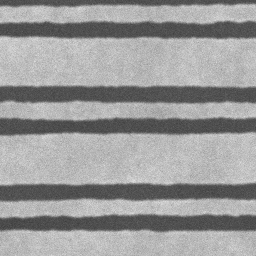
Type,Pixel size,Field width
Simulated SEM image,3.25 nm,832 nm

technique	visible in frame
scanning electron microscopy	lines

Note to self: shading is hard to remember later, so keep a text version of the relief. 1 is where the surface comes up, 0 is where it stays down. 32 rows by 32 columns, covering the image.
00000000000000000000000000000000
11111111111111111111111111111111
11111111111111111111111111111111
00000000000000000000000000000000
00000000000000000000000000000000
11111111111111111111111111111111
11111111111111111111111111111111
11111111111111111111111111111111
11111111111111111111111111111111
11111111111111111111111111111111
11111111111111111111111111111111
00000000000000000000000000000000
00000000000000000000000000000000
11111111111111111111111111111111
11111111111111111111111111111111
00000000000000000000000000000000
00000000000000000000000000000000
11111111111111111111111111111111
11111111111111111111111111111111
11111111111111111111111111111111
11111111111111111111111111111111
11111111111111111111111111111111
11111111111111111111111111111111
00000000000000000000000000000000
00000000000000000000000000000000
11111111111111111111111111111111
11111111111111111111111111111111
00000000000000000000000000000000
00000000000000000000000000000000
11111111111111111111111111111111
11111111111111111111111111111111
11111111111111111111111111111111